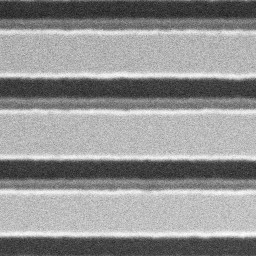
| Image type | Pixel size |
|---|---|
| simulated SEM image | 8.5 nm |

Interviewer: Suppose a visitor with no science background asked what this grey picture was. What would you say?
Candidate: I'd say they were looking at lines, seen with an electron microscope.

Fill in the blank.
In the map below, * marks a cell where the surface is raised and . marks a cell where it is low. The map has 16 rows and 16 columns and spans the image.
................
................
****************
****************
****************
................
................
****************
****************
****************
................
................
****************
****************
****************
................